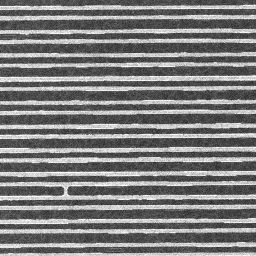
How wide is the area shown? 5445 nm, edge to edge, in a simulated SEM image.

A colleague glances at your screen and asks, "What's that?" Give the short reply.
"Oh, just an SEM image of parallel lines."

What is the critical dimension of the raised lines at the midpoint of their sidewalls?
71.8 nanometres